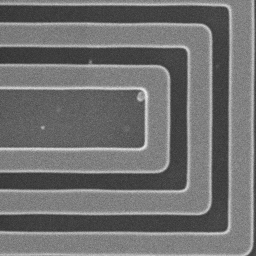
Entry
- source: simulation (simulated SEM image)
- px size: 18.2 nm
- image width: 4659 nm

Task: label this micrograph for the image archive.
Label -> groups of lines, slits or small figures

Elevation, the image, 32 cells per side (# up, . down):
################################
.............................###
.............................###
##########################...###
##########################...###
##########################...###
.......................###...###
........................##...###
#####################...##...###
#####################...##...###
#####################...##...###
..................###...##...###
..................###...##...###
..................###..###...###
..................###..###...###
..................###..###...###
..................###...##...###
..................###...##...###
..................###...##...###
#####################...##...###
#####################...##...###
.......#############...###...###
.......................###...###
.......................###...###
##########################...###
##########################...###
##########################...###
.............................###
.............................###
################################
################################
###############################.